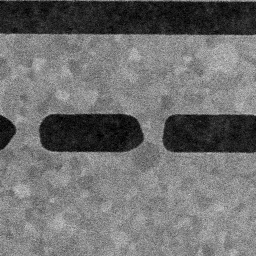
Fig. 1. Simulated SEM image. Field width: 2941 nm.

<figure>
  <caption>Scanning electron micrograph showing one or a few lines or trenches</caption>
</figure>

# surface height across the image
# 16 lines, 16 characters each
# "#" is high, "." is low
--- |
................
................
################
################
################
################
################
.##......#......
.#.......#......
####....###.....
################
################
################
################
################
################